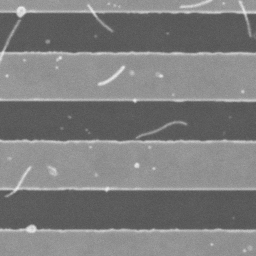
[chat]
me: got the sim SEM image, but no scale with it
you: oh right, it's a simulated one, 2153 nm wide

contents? lines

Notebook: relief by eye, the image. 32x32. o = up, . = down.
oooooooooooooooooooooooooooooooo
oooooooooooooooooooooooooooooooo
................................
................................
................................
................................
o..oo.o.........o...............
oooooooooooooooooooooooooooooooo
oooooooooooooooooooooooooooooooo
oooooooooooooooooooooooooooooooo
oooooooooooooooooooooooooooooooo
oooooooooooooooooooooooooooooooo
oooooooooooooooooooooooooooooooo
................................
................................
................................
................................
................................
oooooooooooooooooooooooooooooooo
oooooooooooooooooooooooooooooooo
oooooooooooooooooooooooooooooooo
oooooooooooooooooooooooooooooooo
oooooooooooooooooooooooooooooooo
oooooooooooooooooooooooooooooooo
................................
................................
................................
................................
...oo...........................
oooooooooooooooooooooooooooooooo
oooooooooooooooooooooooooooooooo
oooooooooooooooooooooooooooooooo